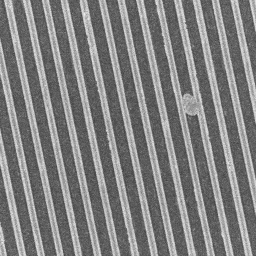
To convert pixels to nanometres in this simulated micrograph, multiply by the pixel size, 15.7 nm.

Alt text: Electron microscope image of parallel lines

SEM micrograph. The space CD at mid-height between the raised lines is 213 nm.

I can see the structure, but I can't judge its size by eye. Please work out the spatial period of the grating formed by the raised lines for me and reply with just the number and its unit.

0.29 um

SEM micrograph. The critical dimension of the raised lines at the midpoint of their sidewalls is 4.54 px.